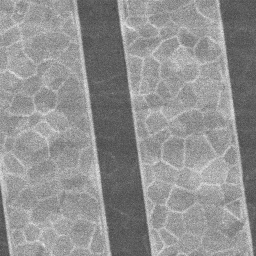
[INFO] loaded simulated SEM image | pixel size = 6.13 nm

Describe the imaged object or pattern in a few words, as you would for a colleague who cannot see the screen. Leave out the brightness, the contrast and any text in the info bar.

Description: one or a few lines or trenches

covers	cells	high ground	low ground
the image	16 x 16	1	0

1111100111111100
1111100011111100
1111100011111100
1111100011111100
1111100011111100
1111100011111100
1111110011111100
1111110011111110
1111110001111110
1111110001111110
1111110001111110
1111110001111110
1111110001111110
1111110001111110
0111111001111111
0111111001111111